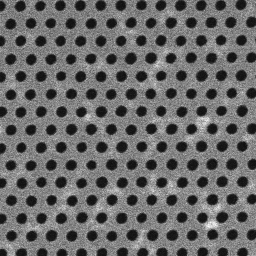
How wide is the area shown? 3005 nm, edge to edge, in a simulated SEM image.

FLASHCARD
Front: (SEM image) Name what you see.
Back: a regular array of holes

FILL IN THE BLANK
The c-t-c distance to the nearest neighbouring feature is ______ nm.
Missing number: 231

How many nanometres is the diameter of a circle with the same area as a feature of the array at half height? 134